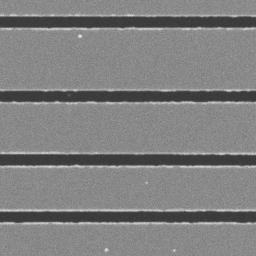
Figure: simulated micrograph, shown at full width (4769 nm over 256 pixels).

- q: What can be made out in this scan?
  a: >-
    lines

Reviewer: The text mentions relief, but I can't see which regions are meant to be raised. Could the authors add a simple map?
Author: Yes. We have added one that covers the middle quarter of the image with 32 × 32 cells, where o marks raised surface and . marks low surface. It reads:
oooooooooooooooooooooooooooooooo
oooooooooooooooooooooooooooooooo
oooooooooooooooooooooooooooooooo
oooooooooooooooooooooooooooooooo
oooooooooooooooooooooooooooooooo
oooooooooooooooooooooooooooooooo
oooooooooooooooooooooooooooooooo
................................
................................
................................
oooooooooooooooooooooooooooooooo
oooooooooooooooooooooooooooooooo
oooooooooooooooooooooooooooooooo
oooooooooooooooooooooooooooooooo
oooooooooooooooooooooooooooooooo
oooooooooooooooooooooooooooooooo
oooooooooooooooooooooooooooooooo
oooooooooooooooooooooooooooooooo
oooooooooooooooooooooooooooooooo
oooooooooooooooooooooooooooooooo
oooooooooooooooooooooooooooooooo
oooooooooooooooooooooooooooooooo
o.....oo..........o..........ooo
................................
................................
..oo............................
oooooooooooooooooooooooooooooooo
oooooooooooooooooooooooooooooooo
oooooooooooooooooooooooooooooooo
oooooooooooooooooooooooooooooooo
oooooooooooooooooooooooooooooooo
oooooooooooooooooooooooooooooooo